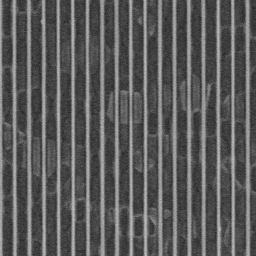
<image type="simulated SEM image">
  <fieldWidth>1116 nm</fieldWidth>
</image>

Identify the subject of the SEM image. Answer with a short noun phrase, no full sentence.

parallel lines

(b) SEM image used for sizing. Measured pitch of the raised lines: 63.5 nm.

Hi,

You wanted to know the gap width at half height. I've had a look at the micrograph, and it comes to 51.8 nanometers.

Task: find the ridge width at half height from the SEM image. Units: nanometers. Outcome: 14.7